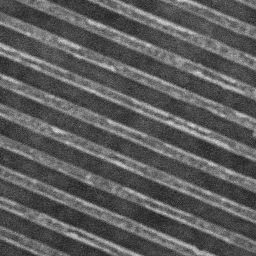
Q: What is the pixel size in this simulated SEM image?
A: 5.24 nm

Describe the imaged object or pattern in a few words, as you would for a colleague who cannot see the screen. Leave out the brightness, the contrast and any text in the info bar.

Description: parallel lines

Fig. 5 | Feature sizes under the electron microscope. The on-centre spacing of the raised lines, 0.148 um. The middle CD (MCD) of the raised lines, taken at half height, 0.0532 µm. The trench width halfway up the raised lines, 93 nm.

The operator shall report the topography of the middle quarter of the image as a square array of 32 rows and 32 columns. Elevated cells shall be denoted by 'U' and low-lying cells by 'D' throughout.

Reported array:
DDDDDDDDDUUUUUUUDDDDDDDDDDDUUUUU
DDDDDDDDDDDDUUUUUUDDDDDDDDDDDDUU
UUDDDDDDDDDDDDUUUUUUUDDDDDDDDDDD
UUUUUDDDDDDDDDDDUUUUUUUDDDDDDDDD
DUUUUUUDDDDDDDDDDDDUUUUUUDDDDDDD
DDDUUUUUUUDDDDDDDDDDDUUUUUUUDDDD
DDDDDDUUUUUUDDDDDDDDDDDDUUUUUUUD
DDDDDDDDUUUUUUDDDDDDDDDDDDUUUUUU
DDDDDDDDDDUUUUUUUDDDDDDDDDDDUUUU
UDDDDDDDDDDDDUUUUUUDDDDDDDDDDDDU
UUUDDDDDDDDDDDDUUUUUUDDDDDDDDDDD
UUUUUUDDDDDDDDDDDUUUUUUUDDDDDDDD
DUUUUUUUDDDDDDDDDDDDUUUUUUDDDDDD
DDDDUUUUUUUDDDDDDDDDDDUUUUUUUDDD
DDDDDDUUUUUUDDDDDDDDDDDDDUUUUUUD
DDDDDDDDUUUUUUUDDDDDDDDDDDDUUUUU
DDDDDDDDDDDUUUUUUUDDDDDDDDDDDDUU
UUDDDDDDDDDDDUUUUUUUDDDDDDDDDDDD
UUUUDDDDDDDDDDDDUUUUUUUDDDDDDDDD
UUUUUUDDDDDDDDDDDDUUUUUUUDDDDDDD
DDUUUUUUUDDDDDDDDDDDUUUUUUUDDDDD
DDDDUUUUUUUDDDDDDDDDDDDUUUUUUDDD
DDDDDDDUUUUUUUDDDDDDDDDDDUUUUUUU
DDDDDDDDDUUUUUUUDDDDDDDDDDDDUUUU
DDDDDDDDDDDDUUUUUUDDDDDDDDDDDDUU
UUUDDDDDDDDDDDUUUUUUUDDDDDDDDDDD
UUUUUDDDDDDDDDDDUUUUUUUDDDDDDDDD
DUUUUUUDDDDDDDDDDDDUUUUUUUDDDDDD
DDDUUUUUUDDDDDDDDDDDDUUUUUUUDDDD
DDDDDUUUUUUUDDDDDDDDDDDUUUUUUUDD
DDDDDDDDUUUUUUDDDDDDDDDDDDUUUUUU
DDDDDDDDDDUUUUUUUDDDDDDDDDDDDUUU